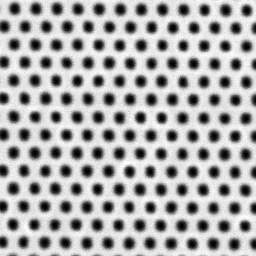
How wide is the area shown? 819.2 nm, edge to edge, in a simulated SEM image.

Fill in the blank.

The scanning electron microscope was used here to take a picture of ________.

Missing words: a regular array of holes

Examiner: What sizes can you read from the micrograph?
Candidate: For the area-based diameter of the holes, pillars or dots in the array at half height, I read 40.1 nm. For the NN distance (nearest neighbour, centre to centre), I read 0.0661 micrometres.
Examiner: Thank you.